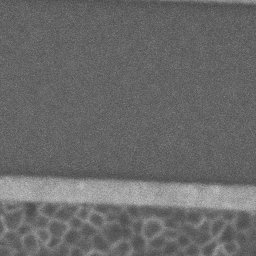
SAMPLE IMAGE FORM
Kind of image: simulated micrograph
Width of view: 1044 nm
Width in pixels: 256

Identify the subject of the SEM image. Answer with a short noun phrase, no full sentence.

one or a few lines or trenches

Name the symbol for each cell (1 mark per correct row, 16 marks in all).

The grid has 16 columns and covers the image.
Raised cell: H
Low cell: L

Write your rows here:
LLLLLLLLLLLLLLLL
LLLLLLLLLLLLLLLL
LLLLLLLLLLLLLLLL
LLLLLLLLLLLLLLLL
LLLLLLLLLLLLLLLL
LLLLLLLLLLLLLLLL
LLLLLLLLLLLLLLLL
LLLLLLLLLLLLLLLL
LLLLLLLLLLLLLLLL
LLLLLLLLLLLLLLLL
LLLLLLLLLLLLLLLL
LLLLLLLLLLLLLLLL
HHHHHHHHHHHHHHLL
HHHHHHHHHHHHHHHH
HHHHHHHHHHHHHHHH
HHHHHHHHHHHHHHHH